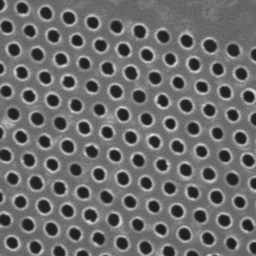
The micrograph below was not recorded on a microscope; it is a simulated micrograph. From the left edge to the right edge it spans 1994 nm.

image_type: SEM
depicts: a regular array of holes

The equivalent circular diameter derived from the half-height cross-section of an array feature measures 93.8 nm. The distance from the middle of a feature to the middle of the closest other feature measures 0.185 micrometres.